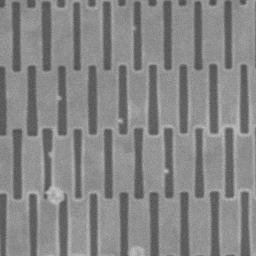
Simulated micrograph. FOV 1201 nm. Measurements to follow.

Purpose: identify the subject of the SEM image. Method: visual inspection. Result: groups of lines, slits or small figures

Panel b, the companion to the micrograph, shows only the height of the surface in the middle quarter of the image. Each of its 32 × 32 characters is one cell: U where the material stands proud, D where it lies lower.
UUDDUUDDUUDDUUDDUDDDUDDUUDDUUDDU
DUDDUUDDUUDDUDDDUDDDUDDUUDDUUDDU
DUUUUUDDUUUUUDDDUUUUUDDUUUUUUDDU
DUUUUUDDUUUUUDDDUUUUUDDUUUUUUDDU
DUUUUUDDUUUUUDDDUUUUUDDUUUUUUDDU
DUUUUUDDUUUUUDDDUUUUUDDUUUUUUDDU
DUUUUUDDUUUUUDDDUUUUUDDUUUUUDDDU
DUUUUUDDUUUUUDDDUUUUUDDDUUUUDDDU
DUUUUUDDUUUUUDDDUUUUUDDDUUUUDDDU
DUUUUUDDUUUUUDDDUUUUUDDDUUUUDDDU
DUUUUUDDUUUUUDDDUUUUUDDDUUUUDDDU
DUUUUUDDUUUUUDDDUUUUUDDDUUUUDDDU
DUUUUUDDUUUUUDDDUUUUUDDDUUUUDDDU
DUUUUUDDUUUUUDDDUUUUUDDDUUUUDDDU
DUUUUUDDUUUUUDDDUUUUUDDDUUUUUDDU
DUUUUUDDUUUUUDDDUUUUUDDDUUUUUDDU
DUDDDUDDUUDDUDDDUDDDUDDDUDDDUDDU
DUDDDUDDUUDDUUDDUDDDUDDDUDDDUDDU
UUDDDUUUUUDDUUUUUDDDUUUUUDDDUUUU
UUDDDUUUUUDDUUUUUDDDUUUUUDDUUUUU
UUDDDUUUUUDDUUUUUDDDUUUUUDDUUUUU
UUDDDUUUUUDDUUUUUDDDUUUUUDDUUUUU
UUDDDUUUUUDDUUUUUUDDUUUUUDDUUUUU
UUDDDUUUUUDDUUUUUUDDUUUUUDDUUUUU
UUDDDUUUUUDDUUUUUUDDUUUUUDDDUUUU
UUDDDUUUUUDDUUUUUUDDUUUUUDDDUUUU
UUDDDUUUUUDDUUUUUUDDUUUUUDDDUUUU
UUDDDUUUUUDDUUUUUUDDUUUUUDDDUUUU
UUDDDUUUUUDDUUUUUDDDUUUUUDDDUUUU
UUDDDUUUUUDDUUUUUDDDUUUUUDDDUUUU
UUDDDUUUUUDDUUUUUDDDUUUUUDDDUUUU
UUDDDUUUUUDDUUUUUDDDUUUUUDDDUUUU